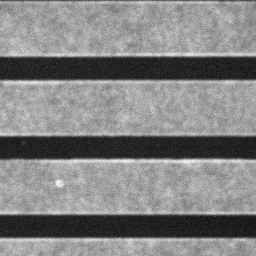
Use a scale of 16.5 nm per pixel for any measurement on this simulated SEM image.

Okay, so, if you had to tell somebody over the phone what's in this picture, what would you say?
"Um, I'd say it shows lines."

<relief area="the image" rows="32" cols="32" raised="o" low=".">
oooooooooooooooooooooooooooooooo
oooooooooooooooooooooooooooooooo
oooooooooooooooooooooooooooooooo
oooooooooooooooooooooooooooooooo
oooooooooooooooooooooooooooooooo
oooooooooooooooooooooooooooooooo
oooooooooooooooooooooooooooooooo
................................
................................
................................
oooooooooooooooooooooooooooooooo
oooooooooooooooooooooooooooooooo
oooooooooooooooooooooooooooooooo
oooooooooooooooooooooooooooooooo
oooooooooooooooooooooooooooooooo
oooooooooooooooooooooooooooooooo
oooooooooooooooooooooooooooooooo
................................
................................
................................
oooooooooooooooooooooooooooooooo
oooooooooooooooooooooooooooooooo
oooooooooooooooooooooooooooooooo
oooooooooooooooooooooooooooooooo
oooooooooooooooooooooooooooooooo
oooooooooooooooooooooooooooooooo
oooooooooooooooooooooooooooooooo
................................
................................
................................
oooooooooooooooooooooooooooooooo
oooooooooooooooooooooooooooooooo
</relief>